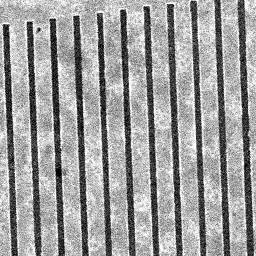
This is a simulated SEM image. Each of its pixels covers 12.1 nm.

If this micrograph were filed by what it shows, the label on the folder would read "parallel lines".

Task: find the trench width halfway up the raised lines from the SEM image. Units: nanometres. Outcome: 82.9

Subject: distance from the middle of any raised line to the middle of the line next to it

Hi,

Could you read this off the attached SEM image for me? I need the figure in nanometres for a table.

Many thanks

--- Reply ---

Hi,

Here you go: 284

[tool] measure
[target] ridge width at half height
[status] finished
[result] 204 nanometres